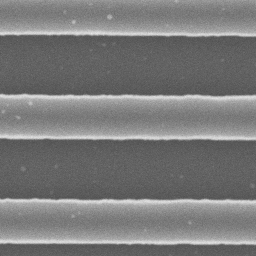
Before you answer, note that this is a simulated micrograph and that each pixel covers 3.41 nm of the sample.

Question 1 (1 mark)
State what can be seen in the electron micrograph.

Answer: lines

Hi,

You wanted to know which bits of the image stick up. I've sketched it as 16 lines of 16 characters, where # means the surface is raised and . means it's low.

################
################
................
................
................
................
################
################
################
................
................
................
#####.####.##...
################
################
................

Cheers